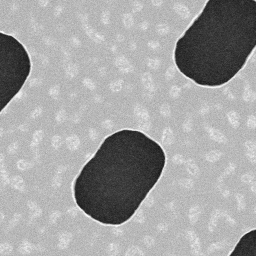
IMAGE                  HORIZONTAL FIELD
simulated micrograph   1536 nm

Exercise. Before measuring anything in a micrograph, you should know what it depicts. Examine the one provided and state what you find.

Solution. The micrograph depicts holes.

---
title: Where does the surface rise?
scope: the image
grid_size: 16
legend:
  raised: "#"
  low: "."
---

#############...
############....
.##########.....
..#########.....
..#########....#
.###############
################
################
#######..#######
######....######
#####.....######
#####.....######
#####....#######
######..########
################
###############.